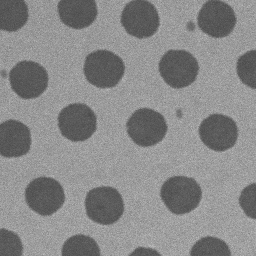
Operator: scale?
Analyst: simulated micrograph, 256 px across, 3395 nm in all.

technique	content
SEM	a regular array of holes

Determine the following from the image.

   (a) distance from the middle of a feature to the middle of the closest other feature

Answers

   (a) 0.86 micrometres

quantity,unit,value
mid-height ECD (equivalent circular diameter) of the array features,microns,0.533